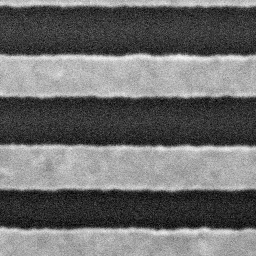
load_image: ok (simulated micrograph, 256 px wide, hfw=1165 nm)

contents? lines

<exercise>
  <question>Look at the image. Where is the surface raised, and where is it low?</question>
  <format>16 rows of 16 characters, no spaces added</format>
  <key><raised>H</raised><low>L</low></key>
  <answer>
LLLLLLLLLLLLLLLL
LLLLLLLLLLLLLLLL
LLLLLLLLLLLLLLLL
HLLHHHLLHHLHLLHL
HHHHHHHHHHHHHHHH
HHHHHHHHHHHHHHHH
LLLLLLLLLLLLLLLL
LLLLLLLLLLLLLLLL
LLLLLLLLLLLLLLLL
HHHHHHHHHHHHHHHH
HHHHHHHHHHHHHHHH
HHHHHHHHHHHHHHHH
LLLLLLLLLLLLLLLL
LLLLLLLLLLLLLLLL
HHHHHHHHHHHHHHHH
HHHHHHHHHHHHHHHH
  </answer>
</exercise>